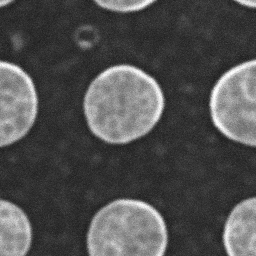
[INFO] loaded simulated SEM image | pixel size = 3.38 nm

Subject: raised bodies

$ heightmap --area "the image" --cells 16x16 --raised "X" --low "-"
-------XX-------
----------------
----------------
----------------
X------XX-----XX
XX----XXXX---XXX
XX---XXXXX---XXX
XX----XXXX---XXX
X-----XXX-----XX
----------------
----------------
----------------
----------------
XX----XXXX----XX
XX----XXXX----XX
XX----XXXX----XX